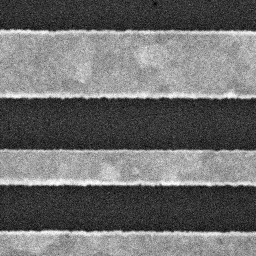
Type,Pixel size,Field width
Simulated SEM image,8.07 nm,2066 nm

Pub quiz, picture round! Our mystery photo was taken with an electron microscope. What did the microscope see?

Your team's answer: lines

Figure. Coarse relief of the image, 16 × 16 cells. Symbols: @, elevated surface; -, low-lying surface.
----------------
----------------
@@@@@@@@@@@@@@@@
@@@@@@@@@@@@@@@@
@@@@@@@@@@@@@@@@
@@@@@@@@@@@@@@@@
----------------
----------------
----------------
@@@@@@@@@@@@@@@@
@@@@@@@@@@@@@@@@
@@@@@@@@@@@@@@@@
----------------
----------------
@@@@@@@@@-@-----
@@@@@@@@@@@@@@@@